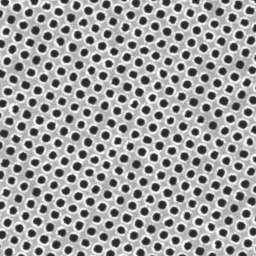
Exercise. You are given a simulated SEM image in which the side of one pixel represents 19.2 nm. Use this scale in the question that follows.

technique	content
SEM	a regular array of holes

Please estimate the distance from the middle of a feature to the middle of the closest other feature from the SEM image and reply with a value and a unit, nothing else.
0.251 microns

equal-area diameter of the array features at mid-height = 174 nanometers